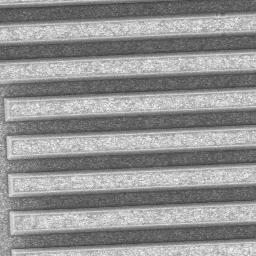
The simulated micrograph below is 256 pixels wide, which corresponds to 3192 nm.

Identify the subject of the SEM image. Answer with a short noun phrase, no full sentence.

parallel lines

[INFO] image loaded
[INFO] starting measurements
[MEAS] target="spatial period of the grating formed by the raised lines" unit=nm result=472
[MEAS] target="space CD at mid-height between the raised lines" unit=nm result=221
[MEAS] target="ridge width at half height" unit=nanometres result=252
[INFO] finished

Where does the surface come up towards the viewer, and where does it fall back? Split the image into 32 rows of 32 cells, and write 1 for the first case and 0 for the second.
11111110000000000000000000000000
00000000000000000000000000000000
00000000000000111111111111111111
11111111111111111111111111111111
11111111111111111111110000000000
00000000000000000000000000000000
00000000000000000000000000001111
00000011111111111111111111111111
11111111111111111111111111111111
11111111111111110000000000000000
00000000000000000000000000000000
00000000000000000000000111111111
01111111111111111111111111111111
01111111111111111111111111111111
01111111110000000000000000000000
00000000000000000000000000000000
00000000000000000001111111111111
01111111111111111111111111111111
01111111111111111111111111111000
01110000000000000000000000000000
00000000000000000000000000000000
00000000000011111111111111111111
01111111111111111111111111111111
01111111111111111111100000000000
00000000000000000000000000000000
00000000000000000000000000001111
00000111111111111111111111111111
01111111111111111111111111111111
00111111111111100000000000000000
00000000000000000000000000000000
00000000000000000000001111111111
00111111111111111111111111111111